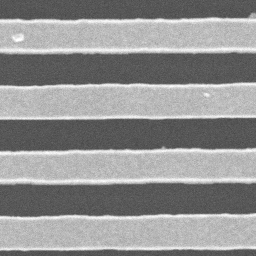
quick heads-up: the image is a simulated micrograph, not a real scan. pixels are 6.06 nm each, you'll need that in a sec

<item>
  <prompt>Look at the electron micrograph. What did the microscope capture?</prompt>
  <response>lines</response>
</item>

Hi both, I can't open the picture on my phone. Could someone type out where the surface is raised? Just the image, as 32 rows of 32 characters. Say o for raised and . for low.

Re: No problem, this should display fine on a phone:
................................
................................
ooo.ooo..ooooooooooooooooooooooo
oooooooooooooooooooooooooooooooo
oooooooooooooooooooooooooooooooo
oooooooooooooooooooooooooooooooo
....oo..........................
................................
................................
................................
.............................ooo
oooooooooooooooooooooooooooooooo
oooooooooooooooooooooooooooooooo
oooooooooooooooooooooooooooooooo
oooooooooooooooooooooooooooooooo
................................
................................
................................
................................
oooooooooooooooooooooooooooooooo
oooooooooooooooooooooooooooooooo
oooooooooooooooooooooooooooooooo
oooooooooooooooooooooooooooooooo
................................
................................
................................
................................
oooooooooooooooooooooooooooooooo
oooooooooooooooooooooooooooooooo
oooooooooooooooooooooooooooooooo
oooooooooooooooooooooooooooooooo
................................